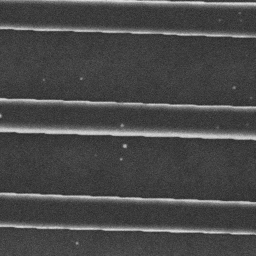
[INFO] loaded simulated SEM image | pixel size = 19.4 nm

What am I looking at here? lines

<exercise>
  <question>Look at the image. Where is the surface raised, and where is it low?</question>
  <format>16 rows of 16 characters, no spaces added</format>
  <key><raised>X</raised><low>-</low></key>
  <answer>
XXXXXXXXXXXXXXXX
XXXXXXXXXXXXXXXX
----------------
----------------
----------------
----------------
XXXXXXXXX-------
XXXXXXXXXXXXXXXX
----------XXXXXX
----------------
----------------
----------------
XXXXXXXXXXXX----
XXXXXXXXXXXXXXXX
------------XXXX
----------------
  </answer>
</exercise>